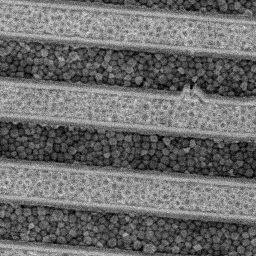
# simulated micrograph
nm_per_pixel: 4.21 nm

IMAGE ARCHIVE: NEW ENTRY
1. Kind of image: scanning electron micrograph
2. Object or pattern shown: one or a few lines or trenches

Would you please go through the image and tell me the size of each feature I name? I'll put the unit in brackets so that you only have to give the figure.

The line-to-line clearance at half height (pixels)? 50.1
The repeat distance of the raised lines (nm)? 342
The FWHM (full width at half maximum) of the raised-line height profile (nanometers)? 134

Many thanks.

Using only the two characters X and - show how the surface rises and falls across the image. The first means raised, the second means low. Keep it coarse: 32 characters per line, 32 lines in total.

XXXXX---------------------------
XXXXXXXXXXXXXXXX----------------
XXXXXXXXXXXXXXXXXXXXXXXXXXXX----
XXXXXXXXXXXXXXXXXXXXXXXXXXXXXXXX
-----XXXXXXXXXXXXXXXXXXXXXXXXXXX
-----------------XXXXXXXXXXXXXXX
-----------------------------XXX
--------------------------------
--------------------------------
--------------------------------
X-------------------------------
XXXXXXXXXXXXXX------------------
XXXXXXXXXXXXXXXXXXXXXXXXXX------
XXXXXXXXXXXXXXXXXXXXXXXXXXXXXXXX
---XXXXXXXXXXXXXXXXXXXXXXXXXXXXX
-------------XXXXXXXXXXXXXXXXXXX
-------------------------XXXXXXX
--------------------------------
--------------------------------
--------------------------------
--------------------------------
XXXXXXXXXXX---------------------
XXXXXXXXXXXXXXXXXXXXXX----------
XXXXXXXXXXXXXXXXXXXXXXXXXXXXXXXX
XXXXXXXXXXXXXXXXXXXXXXXXXXXXXXXX
-----------XXXXXXXXXXXXXXXXXXXXX
----------------------XXXXXXXXXX
--------------------------------
--------------------------------
--------------------------------
--------------------------------
XXXXXXXXX-----------------------